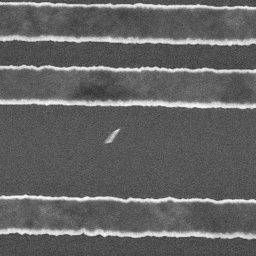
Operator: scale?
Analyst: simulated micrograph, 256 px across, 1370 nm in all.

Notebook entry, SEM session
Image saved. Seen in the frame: lines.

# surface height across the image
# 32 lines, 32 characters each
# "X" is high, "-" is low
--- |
XXXXXXXXX--------X--------------
XXXXXXXXXXXXXXXXXXXXXXXXXXXXXXXX
XXXXXXXXXXXXXXXXXXXXXXXXXXXXXXXX
XXXXXXXXXXXXXXXXXXXXXXXXXXXXXXXX
XXXXXXXXXXXXXXXXXXXXXXXXXXXXXXXX
--------------------------------
--------------------------------
--------------------------------
XXXXXXXXXXXXXX----X-------------
XXXXXXXXXXXXXXXXXXXXXXXXXXXXXXXX
XXXXXXXXXXXXXXXXXXXXXXXXXXXXXXXX
XXXXXXXXXXXXXXXXXXXXXXXXXXXXXXXX
XXXXXXXXXXXXXXXXXXXXXXXXXXXXXXXX
--------------------------------
--------------------------------
--------------------------------
--------------------------------
--------------------------------
--------------------------------
--------------------------------
--------------------------------
--------------------------------
--------------------------------
--------------------------------
---X----------------------------
XXXXXXXXXXXXXXXXXXXXXXXXXXXXXXXX
XXXXXXXXXXXXXXXXXXXXXXXXXXXXXXXX
XXXXXXXXXXXXXXXXXXXXXXXXXXXXXXXX
XXXXXXXXXXXXXXXXXXXXXXXXXXXXXXXX
----------------XX----X--XXXXXXX
--------------------------------
--------------------------------